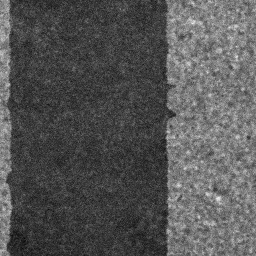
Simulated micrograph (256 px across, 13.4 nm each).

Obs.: one or a few lines or trenches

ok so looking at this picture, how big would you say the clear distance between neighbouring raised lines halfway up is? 2.13 microns